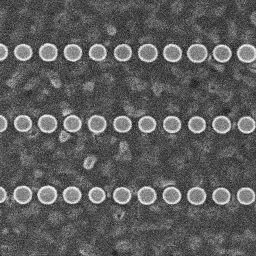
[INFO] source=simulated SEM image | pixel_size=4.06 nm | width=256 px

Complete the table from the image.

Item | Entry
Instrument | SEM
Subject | a regular array of raised bodies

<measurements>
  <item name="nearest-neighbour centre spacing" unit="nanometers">100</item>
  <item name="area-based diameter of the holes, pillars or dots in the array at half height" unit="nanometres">68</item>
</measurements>